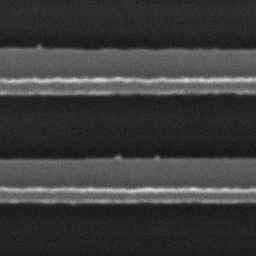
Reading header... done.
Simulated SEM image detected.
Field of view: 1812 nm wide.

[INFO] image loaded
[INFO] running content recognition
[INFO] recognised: lines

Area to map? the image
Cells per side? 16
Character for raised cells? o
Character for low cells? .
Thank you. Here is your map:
................
................
................
oooooooooooooooo
oooooooooooooooo
oooooooooooooooo
................
................
................
................
oooooooooooooooo
oooooooooooooooo
oooooooooooooooo
................
................
................